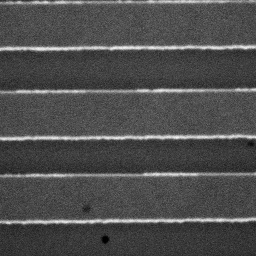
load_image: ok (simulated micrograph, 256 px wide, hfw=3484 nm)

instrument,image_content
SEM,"lines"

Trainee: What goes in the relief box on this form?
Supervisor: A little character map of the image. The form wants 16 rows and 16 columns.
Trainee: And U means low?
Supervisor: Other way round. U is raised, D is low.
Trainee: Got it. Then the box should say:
UUUUUUUUUUUUUUUU
UUUUUUUUUUUUUUUU
UUUUUUUUUUUUUUUU
DDDDDDDDDDDDDDDD
DDDDDDDDDDDDDDDD
DDDDDDDDDDDDDDDD
UUUUUUUUUUUUUUUU
UUUUUUUUUUUUUUUU
UUUUUUUUUUUUUUUU
DDDDDDDDDDDDDDDD
DDDDDDDDDDDDDDDD
UUUUUUUUUUUUUUUU
UUUUUUUUUUUUUUUU
UUUUUUUUUUUUUUUU
DDDDDDDDDDDDDDDD
DDDDDDDDDDDDDDDD